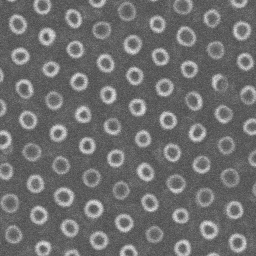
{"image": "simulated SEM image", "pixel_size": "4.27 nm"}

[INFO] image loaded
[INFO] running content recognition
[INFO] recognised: a regular array of raised bodies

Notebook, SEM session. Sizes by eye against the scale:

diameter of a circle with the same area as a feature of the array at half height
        71.4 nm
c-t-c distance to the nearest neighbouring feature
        133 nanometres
